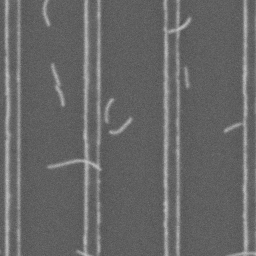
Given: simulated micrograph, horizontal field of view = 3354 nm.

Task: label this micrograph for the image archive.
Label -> lines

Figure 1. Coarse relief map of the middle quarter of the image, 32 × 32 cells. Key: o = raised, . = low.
.....oooo................oooo...
.....oooo................oooo...
.....oooo................oooo...
.....oooo................ooo....
......ooo................oooo...
.....oooo................oooo...
.....oooo................oooo...
.....oooo................oooo...
.....oooo................oooo...
.....oooo................oooo...
.....oooo................oooo...
.....oooo.................ooo...
.....oooo.................ooo...
.....oooo.................ooo...
.....oooo.................oo....
.....oooo................oooo...
.....oooo................oooo...
.....oooo................oooo...
.....oooo................oooo...
.....oooo................oooo...
......ooo................oooo...
......ooo................oooo...
......ooo................oooo...
......ooo................oooo...
.....oooo................oooo...
......ooo................oooo...
......ooo................oooo...
......ooo................oooo...
......ooo................oooo...
......ooo................oooo...
......ooo................oooo...
.....oooo................oooo...